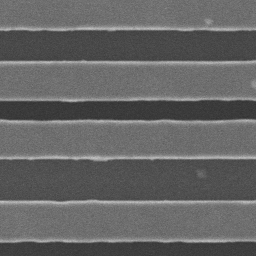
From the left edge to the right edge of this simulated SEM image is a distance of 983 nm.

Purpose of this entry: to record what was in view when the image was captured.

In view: lines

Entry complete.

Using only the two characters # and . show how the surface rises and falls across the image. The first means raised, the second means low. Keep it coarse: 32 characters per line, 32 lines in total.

################################
################################
################################
################################
................................
................................
................................
................................
################################
################################
################################
################################
#########################..##..#
................................
................................
################################
################################
################################
################################
################################
................................
................................
................................
................................
................................
################################
################################
################################
################################
################################
................................
................................